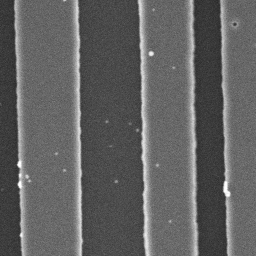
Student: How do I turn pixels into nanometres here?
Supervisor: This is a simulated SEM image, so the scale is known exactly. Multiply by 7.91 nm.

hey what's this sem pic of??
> lines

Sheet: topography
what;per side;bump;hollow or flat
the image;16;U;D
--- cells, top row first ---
DUUUUDDDDUUUDDUU
DUUUUDDDDUUUDDUU
DUUUUDDDDUUUDDUU
DUUUUDDDDUUUDDUU
DUUUUDDDDUUUDDUU
DUUUUDDDDUUUDDUU
DUUUUDDDDUUUDDUU
DUUUUDDDDUUUDDUU
DUUUUDDDDUUUDDUU
DUUUUDDDDUUUDDUU
DUUUUDDDDUUUDDUU
DUUUUDDDDUUUDDUU
DUUUUDDDDUUUDDUU
DUUUUDDDDUUUDDUU
DUUUUDDDDUUUDDUU
DUUUUDDDDUUUDDUU